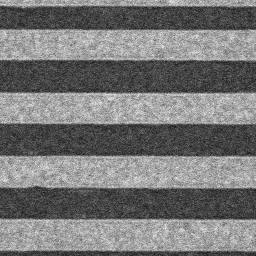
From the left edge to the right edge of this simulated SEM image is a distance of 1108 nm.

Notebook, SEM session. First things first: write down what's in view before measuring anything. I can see one or a few lines or trenches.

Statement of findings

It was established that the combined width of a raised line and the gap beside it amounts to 274 nm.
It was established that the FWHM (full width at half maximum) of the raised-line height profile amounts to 0.124 um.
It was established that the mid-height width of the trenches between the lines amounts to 147 nm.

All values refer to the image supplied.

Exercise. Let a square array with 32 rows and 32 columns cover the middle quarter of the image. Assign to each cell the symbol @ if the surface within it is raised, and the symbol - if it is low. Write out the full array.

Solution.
--------------------------------
--------------------------------
--------------------------------
--------------------------------
--------------------------------
--------------------------------
--------------------------------
--------------------------------
@@@@@@@@@@@@@@@@@@@@@@@@@@@@@@@@
@@@@@@@@@@@@@@@@@@@@@@@@@@@@@@@@
@@@@@@@@@@@@@@@@@@@@@@@@@@@@@@@@
@@@@@@@@@@@@@@@@@@@@@@@@@@@@@@@@
@@@@@@@@@@@@@@@@@@@@@@@@@@@@@@@@
@@@@@@@@@@@@@@@@@@@@@@@@@@@@@@@@
@@@@@@@@@@@@@@@@@@@@@@@@@@@@@@@@
--------------------------------
--------------------------------
--------------------------------
--------------------------------
--------------------------------
--------------------------------
--------------------------------
--------------------------------
@@@@@@@@@@@@@@@@@@@@@@@@@@@@@@@@
@@@@@@@@@@@@@@@@@@@@@@@@@@@@@@@@
@@@@@@@@@@@@@@@@@@@@@@@@@@@@@@@@
@@@@@@@@@@@@@@@@@@@@@@@@@@@@@@@@
@@@@@@@@@@@@@@@@@@@@@@@@@@@@@@@@
@@@@@@@@@@@@@@@@@@@@@@@@@@@@@@@@
@@@@@@@@@@@@@@@@@@@@@@@@@@@@@@@@
@@@@@@@@@@@@@@@@@@@@@@@@@@@@@@@@
--------------------------------